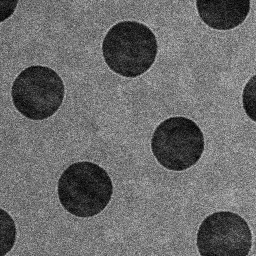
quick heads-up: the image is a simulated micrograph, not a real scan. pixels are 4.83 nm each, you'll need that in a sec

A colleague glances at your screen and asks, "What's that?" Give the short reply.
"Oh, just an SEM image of holes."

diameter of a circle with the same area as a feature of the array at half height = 266 nanometers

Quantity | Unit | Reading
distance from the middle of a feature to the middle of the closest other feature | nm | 496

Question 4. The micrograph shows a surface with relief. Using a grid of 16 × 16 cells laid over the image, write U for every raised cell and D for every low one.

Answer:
DUUUUUUUUUUUDDDD
UUUUUUUDDUUUUDDU
UUUUUUDDDDUUUUUU
UUUUUUDDDDUUUUUU
UDDUUUUDDUUUUUUU
UDDDUUUUUUUUUUUD
UDDDUUUUUUUUUUUD
UUUUUUUUUUDDUUUU
UUUUUUUUUUDDDUUU
UUUUUUUUUUDDDUUU
UUUUDDUUUUDDUUUU
UUUUDDDUUUUUUUUU
UUUUDDDUUUUUUUUU
DUUUUDUUUUUUUDDU
DUUUUUUUUUUUDDDD
DUUUUUUUUUUUDDDD